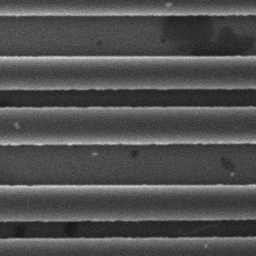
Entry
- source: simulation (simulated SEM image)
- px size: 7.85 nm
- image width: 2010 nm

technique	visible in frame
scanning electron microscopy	lines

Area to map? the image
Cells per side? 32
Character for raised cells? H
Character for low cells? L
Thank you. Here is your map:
HHHHHHHHHHHHHHHHHHHHHHHHHHHHHHHH
HHHHHHHHHHHHHHHHHHHHHHHHHHHHHHHH
LLLLLLLLLLLLLLLLLLLLLLLLLLLLLLLL
LLLLLLLLLLLLLLLLLLLLLLLLLLLLLLLL
LLLLLLLLLLLLLLLLLLLLLLLLLLLLLLLL
LLLLLLLLLLLLLLLLLLLLLLLLLLLLLLLL
LLLLLLLLLLLLLLLLLLLLLLLLLLLLLLLL
HHHHHHHHHHHHHHHHHHHHHHHHHHHHHHHH
HHHHHHHHHHHHHHHHHHHHHHHHHHHHHHHH
HHHHHHHHHHHHHHHHHHHHHHHHHHHHHHHH
HHHHHHHHHHHHHHHHHHHHHHHHHHHHHHHH
LLLLLLLLLLLLLLLLLLLLLLLLLLLLLLLL
LLLLLLLLLLLLLLLLLLLLLLLLLLLLLLLL
HHHLLHHHLHLHHHHHHHHHHHHHHHHHHHHH
HHHHHHHHHHHHHHHHHHHHHHHHHHHHHHHH
HHHHHHHHHHHHHHHHHHHHHHHHHHHHHHHH
HHHHHHHHHHHHHHHHHHHHHHHHHHHHHHHH
HHHHHHHHHHHHHHHHHHHHHHHHHHHHHHHH
LLLLLLLLLLLLLLLLLLLLLLLLLLLLLLLL
LLLLLLLLLLLLLLLLLLLLLLLLLLLLLLLL
LLLLLLLLLLLLLLLLLLLLLLLLLLLLLLLL
LLLLLLLLLLLLLLLLLLLLLLLLLLLLLLLL
LLLLLLLLLLLLLLLLLLLLLLLLLLLLLLLL
HHHHHHHHHHHHHHHHHHHHHHHHHHHHHHHH
HHHHHHHHHHHHHHHHHHHHHHHHHHHHHHHH
HHHHHHHHHHHHHHHHHHHHHHHHHHHHHHHH
HHHHHHHHHHHHHHHHHHHHHHHHHHHHHHHH
HHHHHHHHHHHHHHHHHHLLLLLLLLLLLLLL
LLLLLLLLLLLLLLLLLLLLLLLLLLLLLLLL
LLLLLLLLLLLLLLLLLLLLLLLLLLLLLLLL
HHHHHHHHHHHHHHHHHHHHHHHHHHHHHHHH
HHHHHHHHHHHHHHHHHHHHHHHHHHHHHHHH